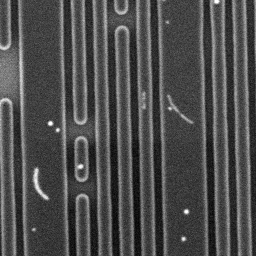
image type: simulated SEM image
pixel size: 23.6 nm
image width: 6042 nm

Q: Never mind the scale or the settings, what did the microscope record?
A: groups of lines, slits or small figures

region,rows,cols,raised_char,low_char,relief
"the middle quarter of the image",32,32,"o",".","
..ooo...ooo..ooo...ooo..oooooooo
..ooo...ooo..ooo...ooo..oooooooo
..ooo...ooo..ooo...ooo..oooooooo
..oooo..ooo..ooo...ooo..oooooooo
..oooo..ooo..ooo...ooo..oooooooo
..oooo..ooo..ooo...ooo..oooooooo
..oooo..ooo..ooo...ooo..oooooooo
..oooo..ooo..ooo...ooo..oooooooo
..oooo..ooo..ooo...ooo..oooooooo
..oooo..ooo..ooo...ooo..oooooooo
...ooo..ooo..ooo...ooo..oooooooo
...ooo..ooo..ooo...ooo..oooooooo
...ooo..ooo..ooo...ooo..oooooooo
...ooo..ooo..ooo...ooo..oooooooo
...oo...ooo..oooo..ooo..oooooooo
........ooo..oooo..ooo..oooooooo
........ooo..oooo..ooo..oooooooo
........ooo..oooo..ooo...ooooooo
...oo...ooo..oooo..ooo...ooooooo
...ooo..ooo..oooo..ooo...ooooooo
...ooo..ooo..oooo..ooo...ooooooo
...ooo..ooo...ooo..ooo...ooooooo
...ooo..ooo...ooo..ooo...ooooooo
...ooo..ooo...ooo..ooo...ooooooo
...ooo..ooo...ooo..ooo...ooooooo
...ooo..ooo...ooo..ooo...ooooooo
...ooo..ooo...ooo..ooo...ooooooo
o..ooo..ooo...ooo..ooo...ooooooo
o..ooo...oo...ooo..ooo...ooooooo
o........oo...ooo..ooo...ooooooo
o........oo...ooo..ooo...ooooooo
o........oo...ooo..ooo...ooooooo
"